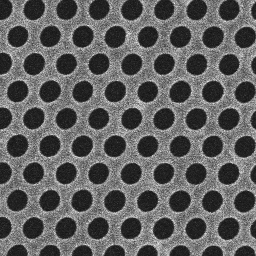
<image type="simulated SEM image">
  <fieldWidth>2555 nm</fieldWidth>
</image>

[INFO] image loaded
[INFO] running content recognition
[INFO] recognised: a regular array of holes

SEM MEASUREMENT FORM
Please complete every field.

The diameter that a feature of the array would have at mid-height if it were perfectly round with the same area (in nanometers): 215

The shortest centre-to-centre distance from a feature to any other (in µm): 0.314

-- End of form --